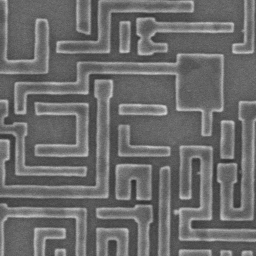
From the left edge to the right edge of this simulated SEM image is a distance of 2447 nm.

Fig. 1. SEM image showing wiring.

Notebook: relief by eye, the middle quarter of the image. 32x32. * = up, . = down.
...*****************************
...*****************************
...****.............************
...***......................****
...***..****................****
******..****................****
******..****................****
*...**..****................****
........***.................****
........***.................****
******..***...***********...****
******..***...************..****
...***..***...........***.......
...***..***.....................
...***..***.....................
...***..***...**................
...***..***...**................
...***..***...**................
...***..***...**................
...***..***...**................
******..***...***...............
******..***...************...***
******..***...************...***
........***..................***
........***..................***
........***..*********.......***
******..***..*********..**...***
*****...***..*********..**...***
........***..*********..**...***
........***..****.****..**...***
........***..****.****..**...***
***********..****.****..**...***